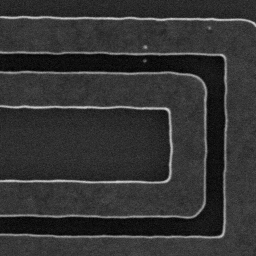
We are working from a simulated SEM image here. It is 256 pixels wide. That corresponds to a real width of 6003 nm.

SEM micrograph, groups of lines, slits or small figures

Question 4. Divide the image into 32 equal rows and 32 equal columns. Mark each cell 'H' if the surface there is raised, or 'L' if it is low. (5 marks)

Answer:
LLLLLLLLLLLLLLLLLLLLLLLLLLLLLLLL
LLLLLLLLLLLLLLLLLLLLLLLLLLLLLLLL
HHHHHHHHHHHHHHHHHHHHHHHHHHHLLLLL
HHHHHHHHHHHHHHHHHHHHHHHHHHHHHHHH
HHHHHHHHHHHHHHHHHHHHHHHHHHHHHHHH
HHHHHHHHHHHHHHHHHHHHHHHHHHHHHHHH
HHHHHHHHHHHHHHHHHHHHHHHHHHHHHHHH
LLLLLLLLLLLLLLLLLLLLLLLLLLLLHHHH
LLLLLLLLLLLLLLLLLLLLLLLLLLLLHHHH
HHHHHHHHHHHHHHHHHHHHHHHHLLLLHHHH
HHHHHHHHHHHHHHHHHHHHHHHHHLLLHHHH
HHHHHHHHHHHHHHHHHHHHHHHHHHLLHHHH
HHHHHHHHHHHHHHHHHHHHHHHHHHLLHHHH
LLLLLLLLLLLLLLLLLLLHHHHHHHLLHHHH
LLLLLLLLLLLLLLLLLLLLLHHHHHLLHHHH
LLLLLLLLLLLLLLLLLLLLLHHHHHLLHHHH
LLLLLLLLLLLLLLLLLLLLLHHHHHLLHHHH
LLLLLLLLLLLLLLLLLLLLLHHHHHLLHHHH
LLLLLLLLLLLLLLLLLLLLLHHHHHLLHHHH
LLLLLLLLLLLLLLLLLLLLLHHHHHLLHHHH
LLLLLLLLLLLLLLLLLLLLLHHHHHLLHHHH
LLLLLLLLLLLLLLLLLLLLLHHHHHLLHHHH
LLLLLLLLLLLLLLLLLLLLLHHHHHLLHHHH
HHHHHHHHHHHHHHHHHHHHHHHHHHLLHHHH
HHHHHHHHHHHHHHHHHHHHHHHHHHLLHHHH
HHHHHHHHHHHHHHHHHHHHHHHHHHLLHHHH
HHHHHHHHHHHHHHHHHHHHHHHHHLLLHHHH
LLLLLLLLLLLLLLLLLLLLLLLLLLLLHHHH
LLLLLLLLLLLLLLLLLLLLLLLLLLLLHHHH
HHHHHHHLLLLLLLLLLLLLLLLLLLLHHHHH
HHHHHHHHHHHHHHHHHHHHHHHHHHHHHHHH
HHHHHHHHHHHHHHHHHHHHHHHHHHHHHHHH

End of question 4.